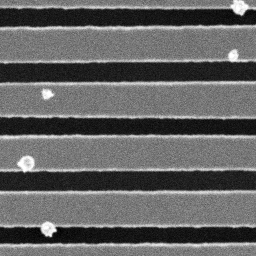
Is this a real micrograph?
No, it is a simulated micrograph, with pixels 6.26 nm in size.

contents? lines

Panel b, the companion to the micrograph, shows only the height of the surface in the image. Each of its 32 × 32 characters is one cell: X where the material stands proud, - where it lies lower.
XXXXXXXXXXXXXXXXXXXXXXXXXXXXXXXX
-----------------------------XX-
--------------------------------
XXXXXXXXXXXXXXXXXXXXXXXXXXXXXXXX
XXXXXXXXXXXXXXXXXXXXXXXXXXXXXXXX
XXXXXXXXXXXXXXXXXXXXXXXXXXXXXXXX
XXXXXXXXXXXXXXXXXXXXXXXXXXXXXXXX
XXXXXXXXXXXXXXXXXXXXXXXXXXXXXXXX
--------------------------------
--------------------------------
XXXXXXXXXXXXXXXXXXXXXXXXXXXXXXXX
XXXXXXXXXXXXXXXXXXXXXXXXXXXXXXXX
XXXXXXXXXXXXXXXXXXXXXXXXXXXXXXXX
XXXXXXXXXXXXXXXXXXXXXXXXXXXXXXXX
XXXXXXXXXXXXXXXXXXXXXXXXXXXXXXXX
--------------------------------
--------------------------------
XXXXXXXXXXXXXXXXXXXXXXXXXXXXXXXX
XXXXXXXXXXXXXXXXXXXXXXXXXXXXXXXX
XXXXXXXXXXXXXXXXXXXXXXXXXXXXXXXX
XXXXXXXXXXXXXXXXXXXXXXXXXXXXXXXX
--------------------------------
--------------------------------
--------------------------------
XXXXXXXXXXXXXXXXXXXXXXXXXXXXXXXX
XXXXXXXXXXXXXXXXXXXXXXXXXXXXXXXX
XXXXXXXXXXXXXXXXXXXXXXXXXXXXXXXX
XXXXXXXXXXXXXXXXXXXXXXXXXXXXXXXX
-----XX-------------------------
--------------------------------
XXXXXXXXXXXXXXXXXXXXXXXXXXXXXXXX
XXXXXXXXXXXXXXXXXXXXXXXXXXXXXXXX